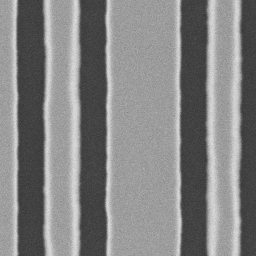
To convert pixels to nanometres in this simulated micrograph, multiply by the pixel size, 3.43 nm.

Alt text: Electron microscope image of lines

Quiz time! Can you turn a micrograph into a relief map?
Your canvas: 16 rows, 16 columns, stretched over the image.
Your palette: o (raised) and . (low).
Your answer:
o..oo..oooo..oo.
o..oo..oooo..oo.
o..oo..oooo..oo.
o..oo..oooo..oo.
o..oo..oooo..oo.
o..oo..oooo..oo.
o..oo..oooo..oo.
o..oo..oooo..oo.
o..oo..oooo..oo.
o..oo..oooo..oo.
o..oo..oooo..oo.
o..oo..oooo..oo.
o..oo..oooo..oo.
o..oo..oooo..oo.
o..oo..oooo..oo.
o..oo..oooo..oo.